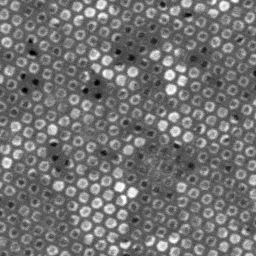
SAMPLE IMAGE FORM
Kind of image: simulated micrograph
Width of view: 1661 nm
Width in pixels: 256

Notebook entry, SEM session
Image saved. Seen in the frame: a regular array of raised bodies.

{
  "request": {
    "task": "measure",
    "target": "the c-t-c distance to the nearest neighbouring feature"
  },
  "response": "90 nanometers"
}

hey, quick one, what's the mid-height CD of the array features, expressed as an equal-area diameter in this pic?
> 0.0533 microns